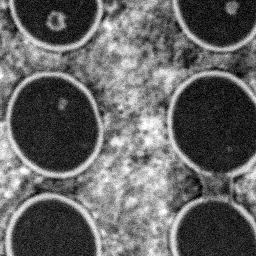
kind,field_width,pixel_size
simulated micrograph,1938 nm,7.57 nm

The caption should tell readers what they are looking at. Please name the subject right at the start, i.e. raised bodies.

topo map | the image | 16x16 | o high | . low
.ooooo.....ooooo
.ooooo.....ooooo
..ooo.......ooo.
................
................
.oooo......oooo.
.ooooo.....ooooo
.ooooo.....ooooo
.ooooo.....ooooo
.ooooo.....ooooo
..ooo.......ooo.
.............o..
..oo........ooo.
.oooo......ooooo
.ooooo.....ooooo
oooooo.....ooooo